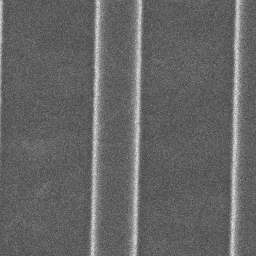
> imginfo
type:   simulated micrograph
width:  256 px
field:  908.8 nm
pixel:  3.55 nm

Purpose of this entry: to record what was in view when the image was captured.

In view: one or a few lines or trenches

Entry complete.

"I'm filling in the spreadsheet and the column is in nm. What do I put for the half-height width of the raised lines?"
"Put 154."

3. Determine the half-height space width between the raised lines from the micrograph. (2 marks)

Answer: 342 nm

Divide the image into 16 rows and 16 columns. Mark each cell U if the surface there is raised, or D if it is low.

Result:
DDDDDDUUUDDDDDDU
DDDDDDUUUDDDDDDU
DDDDDDUUUDDDDDDU
DDDDDDUUUDDDDDDU
DDDDDDUUUDDDDDDU
DDDDDDUUUDDDDDDU
DDDDDDUUUDDDDDDU
DDDDDDUUUDDDDDDU
DDDDDDUUUDDDDDDU
DDDDDDUUUDDDDDDU
DDDDDDUUUDDDDDDU
DDDDDDUUUDDDDDDU
DDDDDDUUUDDDDDDU
DDDDDDUUDDDDDDDU
DDDDDDUUDDDDDDDU
DDDDDDUUDDDDDDUU